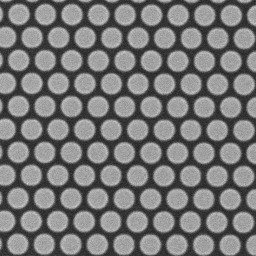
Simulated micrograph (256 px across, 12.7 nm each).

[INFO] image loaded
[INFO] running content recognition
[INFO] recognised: an array of small figures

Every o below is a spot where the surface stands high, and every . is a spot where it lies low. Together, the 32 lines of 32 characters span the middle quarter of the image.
oooo...oooo..oooo...oooo..ooooo.
.oo.....oo....oo.....oo....ooo..
....oo..........................
o..oooo...oooo..oooo...oooo...oo
o..ooooo.ooooo..ooooo..ooooo.ooo
o..ooooo.ooooo..ooooo..ooooo.ooo
o..oooo...oooo..oooo...oooo...oo
.........................o.....o
.oo....oo.....oo.....oo....oo...
oooo..ooooo..oooo...oooo..oooo..
oooo..ooooo..oooo..ooooo..ooooo.
oooo..ooooo..oooo...oooo..ooooo.
oooo...ooo...oooo...oooo...ooo..
................................
....ooo...ooo....ooo....ooo...oo
o..oooo..ooooo..ooooo..oooo...oo
o..ooooo.ooooo..ooooo..ooooo.ooo
o..oooo..ooooo..ooooo..oooo..ooo
....ooo...ooo....ooo....ooo...oo
................................
oooo...ooo...oooo...ooo....ooo..
oooo..ooooo..oooo..ooooo..ooooo.
oooo..ooooo..oooo..ooooo..ooooo.
oooo..ooooo..oooo...oooo..oooo..
.oo.....o.....oo.....oo....ooo..
................................
o..oooo...oooo..oooo...oooo...oo
o..ooooo.ooooo..ooooo..oooo..ooo
o..ooooo.ooooo..ooooo..oooo..ooo
...oooo...oooo...ooo...oooo...oo
................................
.oo....ooo....oo.....oo....oo...